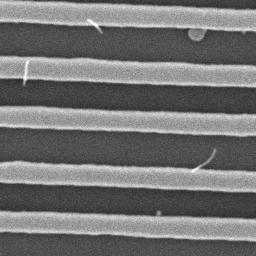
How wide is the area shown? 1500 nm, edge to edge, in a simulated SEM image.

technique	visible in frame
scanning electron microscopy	lines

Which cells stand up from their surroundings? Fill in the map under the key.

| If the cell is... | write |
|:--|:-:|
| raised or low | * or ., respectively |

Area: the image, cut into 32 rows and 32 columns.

**************..................
********************************
********************************
.........................*******
................................
................................
................................
************....................
********************************
********************************
...................*************
................................
................................
*******.........................
********************************
********************************
...................*************
................................
................................
................................
********........................
*******************************.
********************************
..................**************
................................
................................
**..............................
********************************
********************************
................****************
................................
................................